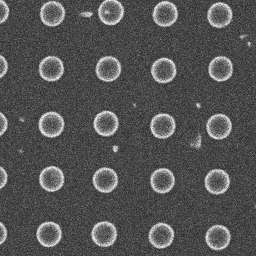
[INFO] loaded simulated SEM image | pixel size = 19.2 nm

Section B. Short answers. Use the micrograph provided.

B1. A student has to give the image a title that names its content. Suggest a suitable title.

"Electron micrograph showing a regular array of raised bodies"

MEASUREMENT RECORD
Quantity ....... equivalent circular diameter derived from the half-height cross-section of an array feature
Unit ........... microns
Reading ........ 0.451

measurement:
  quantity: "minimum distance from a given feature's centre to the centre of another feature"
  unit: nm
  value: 1050